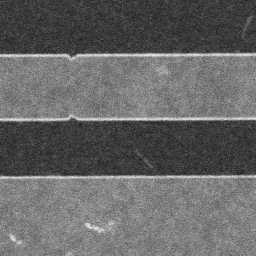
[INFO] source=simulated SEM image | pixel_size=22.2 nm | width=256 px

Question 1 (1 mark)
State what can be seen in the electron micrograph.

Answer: one or a few lines or trenches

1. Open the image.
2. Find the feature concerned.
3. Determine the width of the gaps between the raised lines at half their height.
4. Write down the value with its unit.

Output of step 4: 1.27 um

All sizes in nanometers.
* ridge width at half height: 1450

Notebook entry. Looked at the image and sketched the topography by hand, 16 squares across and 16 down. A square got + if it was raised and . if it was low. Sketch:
................
................
................
++++.+++++++++++
++++++++++++++++
++++++++++++++++
++++++++++++++++
................
................
................
................
++++++++++++++++
++++++++++++++++
++++++++++++++++
++++++++++++++++
++++++++++++++++